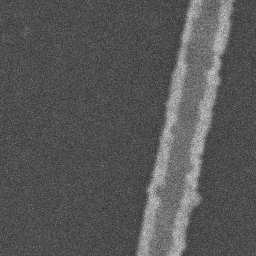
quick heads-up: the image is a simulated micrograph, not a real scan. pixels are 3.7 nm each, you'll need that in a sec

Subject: one or a few lines or trenches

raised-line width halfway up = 150 nanometers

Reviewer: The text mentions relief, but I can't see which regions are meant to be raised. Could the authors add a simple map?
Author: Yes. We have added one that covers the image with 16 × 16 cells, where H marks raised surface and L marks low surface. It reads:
LLLLLLLLLLLLHHLL
LLLLLLLLLLLLHHLL
LLLLLLLLLLLLHHLL
LLLLLLLLLLLHHHLL
LLLLLLLLLLLHHHLL
LLLLLLLLLLLHHLLL
LLLLLLLLLLHHHLLL
LLLLLLLLLLHHHLLL
LLLLLLLLLLHHHLLL
LLLLLLLLLLHHLLLL
LLLLLLLLLLHHLLLL
LLLLLLLLLLHHLLLL
LLLLLLLLLHHHLLLL
LLLLLLLLLHHHLLLL
LLLLLLLLLHHHLLLL
LLLLLLLLLHHLLLLL